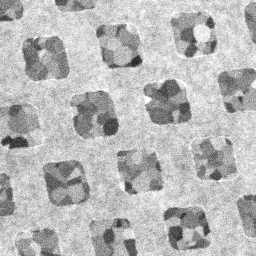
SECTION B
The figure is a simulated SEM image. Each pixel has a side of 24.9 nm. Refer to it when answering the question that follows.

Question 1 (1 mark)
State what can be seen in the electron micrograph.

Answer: a regular array of raised bodies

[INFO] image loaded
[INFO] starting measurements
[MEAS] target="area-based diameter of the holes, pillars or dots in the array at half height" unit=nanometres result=1200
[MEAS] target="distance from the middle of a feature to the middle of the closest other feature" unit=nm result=1830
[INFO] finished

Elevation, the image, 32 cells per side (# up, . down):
###....#####...................#
###.....#...............##.....#
##...................######....#
............#####....######....#
............#####.....#####....#
...#####....######....#####.....
...#####.....#####....#####.....
...#####.....#####..............
...######.......................
...#####...................#####
..................#####....#####
...........##.....#####.....####
.........#####....######....####
####.....#####....######....####
#####....######....#####........
#####....######....###..........
#####....######.................
#####...................#####...
.#......................#####...
...............#####....#####...
......####.....#####....######..
.....######....#####....######..
#.....#####....#####.....####...
##....#####....#####............
##....#####...................##
##.....###....................##
##...................#####....##
............####.....#####....##
...........#####.....#####....##
..#####....######....#####.....#
..#####....######....#####......
..######....#####...............